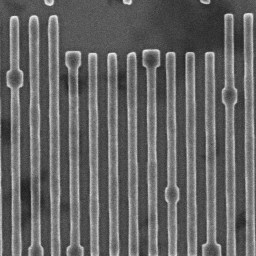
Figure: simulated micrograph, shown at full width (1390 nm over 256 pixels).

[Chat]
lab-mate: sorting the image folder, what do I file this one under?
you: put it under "wiring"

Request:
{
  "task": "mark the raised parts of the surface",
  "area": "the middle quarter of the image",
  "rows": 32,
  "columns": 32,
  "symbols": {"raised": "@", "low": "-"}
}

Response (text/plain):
-@@@--@@---@@---@@--@@@@--@@---@
-@@@--@@---@@---@@---@@---@@---@
-@@---@@---@@---@@---@@---@@---@
-@@---@@---@@---@@---@@---@@---@
-@@---@@---@@---@@---@@---@@---@
-@@---@@---@@---@@---@@---@@---@
-@@---@@---@@---@@---@@---@@---@
-@@---@@---@@---@@---@@---@@---@
-@@@--@@---@@---@@---@@---@@---@
-@@@--@@---@@---@@---@@---@@---@
-@@@--@@---@@---@@---@@---@@---@
-@@@--@@---@@---@@---@@---@@---@
-@@@--@@---@@---@@---@@---@@---@
-@@@--@@---@@---@@---@@---@@---@
-@@@--@@---@@---@@---@@---@@---@
-@@@--@@---@@---@@---@@---@@---@
-@@@--@@---@@---@@---@@---@@---@
-@@@--@@---@@---@@---@@---@@---@
-@@@--@@---@@---@@---@@---@@---@
-@@@--@@---@@---@@---@@---@@---@
-@@@--@@---@@---@@---@@---@@---@
-@@@--@@---@@---@@---@@---@@---@
-@@@--@@---@@---@@---@@---@@---@
-@@@--@@---@@---@@---@@---@@---@
--@@--@@---@@---@@---@@---@@---@
--@@--@@---@@---@@---@@---@@---@
--@@--@@---@@---@@---@@---@@---@
--@@---@---@@---@@---@@---@@---@
--@@---@---@@---@@---@@---@@---@
--@@---@---@@---@@---@@---@@---@
--@@---@---@@---@@---@@---@@---@
--@@---@---@@---@@---@@--@@@@--@